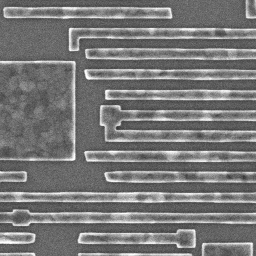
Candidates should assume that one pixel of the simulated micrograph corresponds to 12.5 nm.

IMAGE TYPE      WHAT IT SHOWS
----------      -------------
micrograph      wiring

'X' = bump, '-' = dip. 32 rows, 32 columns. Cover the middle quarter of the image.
XXX-----------------------------
XXX--XXXXXXXXXXXXXXXXXXXX--XXXXX
XXX--XXXXXXXXXXXXXXXXXXXXXXXXXXX
XXX---XXXXXXXXXXXXXXXXXXXXXXXXXX
XXX-----------------------------
XXX-----------------------------
XXX-----------------------------
XXX-------XXXXXXXXXXXXXXXXXXXXXX
XXX-------XXXXXXXXXXXXXXXXXXXXXX
XXX-----------------------------
XXX------XXXXX------------------
XXX------XXXXX------------------
XXX------XXXXXXXXXXXXXXXXXXXXXXX
XXX------XXXXXXXXXXXXXXXXXXXXXXX
XXX------XXXXX------------------
XXX-------XXX-------------------
XXX-------XXX-------------------
XXX-------XXXXXXXXXXXXXXXXXXXXXX
XXX-------XXXXXXXXXXXXXXXXXXXXXX
XXX-----------------------------
XXX-----------------------------
XXX-----------------------------
XXX--XXXXXXXXXXXXXXXXXXXXXXXXXXX
XXX--XXXXXXXXXXXXXXXXXXXXXXXXXXX
--------------------------------
--------------------------------
--------------------------------
----------XXXXXXXXXXXXXXXXXXXXXX
----------XXXXXXXXXXXXXXXXXXXXXX
---------------XXXXXXXXXXXXX----
--------------------------------
--------------------------------